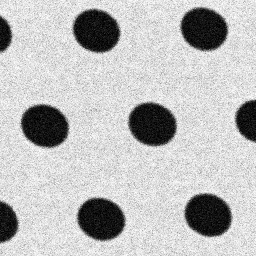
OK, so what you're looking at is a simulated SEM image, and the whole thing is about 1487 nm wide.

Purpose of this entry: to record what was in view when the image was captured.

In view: holes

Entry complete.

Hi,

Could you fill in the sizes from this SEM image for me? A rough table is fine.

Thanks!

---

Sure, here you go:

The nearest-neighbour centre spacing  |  623 nanometres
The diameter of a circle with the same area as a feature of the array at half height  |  265 nm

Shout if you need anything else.